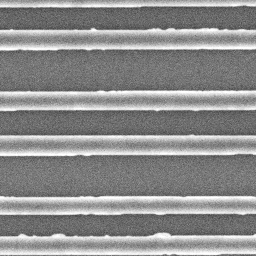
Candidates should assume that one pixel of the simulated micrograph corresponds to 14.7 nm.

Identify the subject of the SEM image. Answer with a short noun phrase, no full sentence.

lines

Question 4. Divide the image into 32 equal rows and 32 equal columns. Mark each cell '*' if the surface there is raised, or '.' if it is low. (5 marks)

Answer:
********************************
................................
................................
................................
********************************
********************************
................................
................................
................................
................................
................................
............*.***********.******
********************************
********************************
................................
................................
................................
********************************
********************************
................................
................................
................................
................................
................................
................................
********************************
********************************
................................
................................
................................
********************************
********************************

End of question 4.